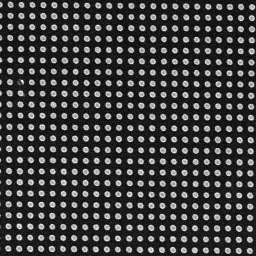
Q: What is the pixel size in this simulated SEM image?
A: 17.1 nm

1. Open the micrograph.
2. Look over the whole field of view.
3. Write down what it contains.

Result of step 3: a regular array of raised bodies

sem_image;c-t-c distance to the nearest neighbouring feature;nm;182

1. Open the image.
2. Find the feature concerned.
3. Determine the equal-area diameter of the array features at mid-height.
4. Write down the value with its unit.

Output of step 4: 5.29 px